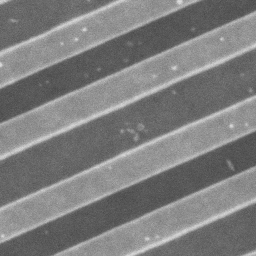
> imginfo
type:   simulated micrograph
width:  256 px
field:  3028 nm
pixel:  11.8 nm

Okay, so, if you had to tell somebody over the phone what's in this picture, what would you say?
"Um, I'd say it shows lines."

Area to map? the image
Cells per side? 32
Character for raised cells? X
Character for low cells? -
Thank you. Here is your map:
--------------XXXXXXXXXX--------
------------XXXXXXXXXX----------
----------XXXXXXXXX-----------XX
-------XXXXXXXXXX----------XXXXX
-----XXXXXXXXXX----------XXXXXXX
---XXXXXXXXX-----------XXXXXXXXX
-XXXXXXXXX-----------XXXXXXXXX--
XXXXXXXX----------XXXXXXXXXX----
XXXXX-----------XXXXXXXXXX------
XXX-----------XXXXXXXXX---------
X-----------XXXXXXXXX-----------
---------XXXXXXXXXX-------------
-------XXXXXXXXX---------------X
-----XXXXXXXXX---------------XXX
--XXXXXXXXXX---------------XXXXX
XXXXXXXXXX--------------XXXXXXXX
XXXXXXX---------------XXXXXXXXX-
XXXXX---------------XXXXXXXXX---
XXX---------------XXXXXXXXX-----
X--------------XXXXXXXXXX-------
-------------XXXXXXXXX----------
-----------XXXXXXXXX----------XX
--------XXXXXXXXXX----------XXXX
------XXXXXXXXX-----------XXXXXX
----XXXXXXXXX-----------XXXXXXXX
-XXXXXXXXXX----------XXXXXXXXXX-
XXXXXXXXX----------XXXXXXXXXX---
XXXXXX-----------XXXXXXXXX------
XXXX-----------XXXXXXXXX--------
XX-----------XXXXXXXXX----------
----------XXXXXXXXX-------------
--------XXXXXXXXX---------------